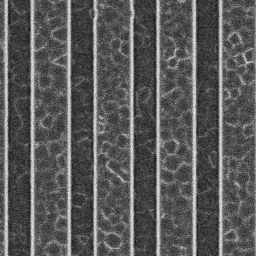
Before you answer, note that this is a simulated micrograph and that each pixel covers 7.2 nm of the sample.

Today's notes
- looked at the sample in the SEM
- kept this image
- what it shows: one or a few lines or trenches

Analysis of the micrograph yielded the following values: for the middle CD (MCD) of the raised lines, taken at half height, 268 nm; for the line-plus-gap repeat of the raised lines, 451 nm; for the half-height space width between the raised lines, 181 nm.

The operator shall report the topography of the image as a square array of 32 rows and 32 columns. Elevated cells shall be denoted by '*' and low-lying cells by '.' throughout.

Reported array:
*...*****...****....****....****
*...*****...*****...****....****
*...*****...*****...****....****
*...*****...****....****....****
*...*****...****....****....****
*...*****...****....****....****
*...*****...****....****....****
*...*****...****....****....****
*...*****...****....****....****
*...*****...****....****....****
*...*****...****....****....****
*...*****...****....****....****
*...*****...****....****....****
*...*****...****....****....****
*...*****...****....****....****
*...*****...****....****....****
*...*****...****....****....****
*...*****...****....****....****
*...*****...****....****....****
*...*****...****....****....****
*...*****...****....****....****
*...*****...****....****....****
*...*****...****....****....****
*...*****...****....****....****
*...*****...****....****....****
*...*****...****....****....****
*...*****...****....****....****
*...*****...****....****....****
*...*****...****....****....****
*...*****...****....****....****
*...*****...****....****....****
*...*****...****....****....****